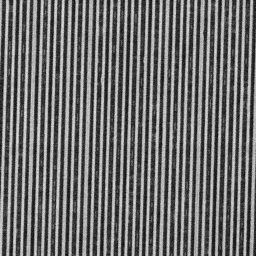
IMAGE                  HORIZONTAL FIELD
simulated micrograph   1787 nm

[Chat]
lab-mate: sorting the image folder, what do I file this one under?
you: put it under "parallel lines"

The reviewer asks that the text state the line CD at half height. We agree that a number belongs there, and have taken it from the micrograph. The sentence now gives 19.2 nanometers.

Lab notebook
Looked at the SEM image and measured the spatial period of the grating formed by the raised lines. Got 48.7 nanometers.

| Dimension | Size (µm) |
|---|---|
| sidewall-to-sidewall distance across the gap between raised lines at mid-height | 0.0314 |